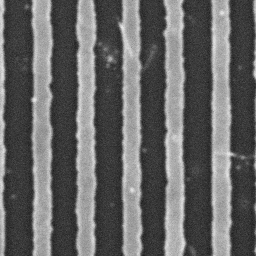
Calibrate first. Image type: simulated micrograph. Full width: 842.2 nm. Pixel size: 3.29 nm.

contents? lines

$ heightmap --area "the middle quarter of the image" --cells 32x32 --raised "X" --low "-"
----XXX--------XXXX------XXXXX--
----XXX--------XXXX------XXXXX--
----XXXX-------XXXX-------XXXX--
----XXXX-------XXXX-------XXXX--
----XXXX-------XXXX-------XXXX--
----XXXX-------XXXX-------XXXX--
----XXXX-------XXXX-------XXXX--
----XXX--------XXXX------XXXXX--
----XXX--------XXXX------XXXXX--
----XXX--------XXXX------XXXXX--
----XXX--------XXXX------XXXXX--
----XXX--------XXXX------XXXXX--
---XXXX--------XXXX------XXXXX--
---XXXX--------XXXX-------XXXX--
---XXXX--------XXXX------XXXXX--
----XXX--------XXXX-------XXXX--
----XXXX-------XXXX-------XXXX--
---XXXXX-------XXXX-------XXXX--
---XXXX--------XXXX------XXXXX--
----XXXX-------XXXX------XXXXX--
----XXXX-------XXXX------XXXXX--
----XXX--------XXXX-------XXXX--
----XXXX-------XXXX-------XXXX--
---XXXXX-------XXXX-------XXX---
---XXXXX-------XXXX-------XXXX--
---XXXXX-------XXXX-------XXXX--
---XXXXX-------XXXX-------XXXX--
----XXXX-------XXXX-------XXXX--
----XXXX-------XXXX-------XXXX--
---XXXXX-------XXXX-------XXXX--
----XXXX-------XXXX-------XXXX--
----XXXX-------XXXX-------XXXX--